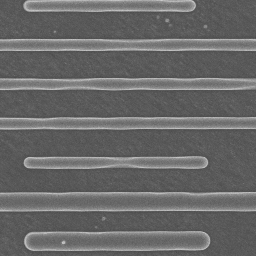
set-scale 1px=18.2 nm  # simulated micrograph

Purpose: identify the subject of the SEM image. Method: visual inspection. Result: groups of lines, slits or small figures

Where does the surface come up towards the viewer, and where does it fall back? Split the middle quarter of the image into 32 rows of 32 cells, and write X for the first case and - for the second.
--------------------------------
--------------------------------
--------------------------------
--------------------------------
XXXXXXXXXXXXXXXXXXXXXXXXXXXXXXXX
XXXXXXXXXXXXXXXXXXXXXXXXXXXXXXXX
--------------------------------
--------------------------------
--------------------------------
--------------------------------
--------------------------------
--------------------------------
--------------------------------
--------------XXXXX----XXXX----X
XXXXXXXXXXXXXXXXXXXXXXXXXXXXXXXX
XXXXXXXXXXXXXXXXXXXXXXXXXXXXXXXX
--------------------------------
--------------------------------
--------------------------------
--------------------------------
--------------------------------
--------------------------------
--------------------------------
XXXXXXXXXXX------XXXXXXXXXXXXXXX
XXXXXXXXXXXXXXXXXXXXXXXXXXXXXXXX
XXXXXXXXXXXXXXXXXXXXXXXXXXXXXXXX
--------------------------------
--------------------------------
--------------------------------
--------------------------------
--------------------------------
--------------------------------